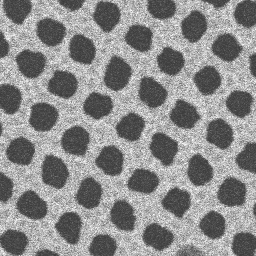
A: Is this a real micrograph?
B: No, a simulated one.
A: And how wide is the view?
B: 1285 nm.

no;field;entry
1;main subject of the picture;a regular array of holes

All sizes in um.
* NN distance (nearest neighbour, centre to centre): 0.191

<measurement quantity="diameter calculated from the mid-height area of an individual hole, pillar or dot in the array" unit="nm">142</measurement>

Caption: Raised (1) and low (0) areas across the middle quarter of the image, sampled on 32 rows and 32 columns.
11111111111000000111111000000011
11111111111000000111111100000111
00111111110000000111111111001111
00011111110000001110001111111111
00011111110000001110000111111111
00011111110000011110000001111111
00011111111100111110000000111111
00011110011111111110000000111111
01111100000011111110000000111111
11111000000011111111000001110001
11111000000011111111100011110000
11111000000011111111111111100000
11111000000111110011111111000000
11111110011111100000111111000000
11111111111111000000111111100000
11001111111110000000111111110000
10000111111110000000111111111111
00000011111110000001111001111111
00000011111111100001110000011111
00000011111111111111110000001111
00000011111001111111100000000111
00000011100000111111100000000111
11000111100000011111110000001111
11111111000000011111111000001111
11111111000000011111111100011110
01111111000000011111111110111110
01111111100000011100011111111110
01111111110000111000000111111110
01111001111111110000000011111110
01110000111111110000000011111111
11110000011111110000000111111111
11110000011111111000000111000011